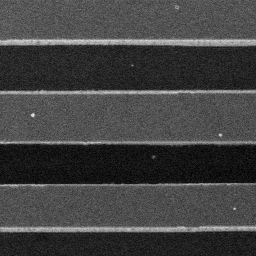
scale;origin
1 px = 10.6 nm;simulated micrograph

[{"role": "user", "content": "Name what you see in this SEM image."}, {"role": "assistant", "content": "lines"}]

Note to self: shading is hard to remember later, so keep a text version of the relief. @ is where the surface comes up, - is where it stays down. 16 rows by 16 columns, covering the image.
@@@@@@@@@@@@@@@@
@@@@@@@@@@@@@@@@
@@@@@@@@@@@@@@@@
----------------
----------------
----------------
@@@@@@@@@@@@@@@@
@@@@@@@@@@@@@@@@
@@@@@@@@@@@@@@@@
----------------
----------------
-----------@@@@@
@@@@@@@@@@@@@@@@
@@@@@@@@@@@@@@@@
----------------
----------------